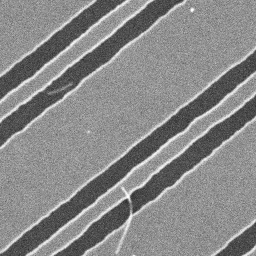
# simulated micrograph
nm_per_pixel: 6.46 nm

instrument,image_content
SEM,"lines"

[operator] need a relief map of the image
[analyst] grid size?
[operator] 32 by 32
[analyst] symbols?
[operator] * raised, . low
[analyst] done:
************...****...**********
**********....***....***********
*********....***....************
********...****....*************
******....****...***************
*****....****...****************
****....***....*****************
***...****....****************..
*....****...*****************...
....****...*****************...*
...***....*****************...**
.****....****************....***
****....****************....***.
**....*****************....***..
*....*****************...****...
....****************....***....*
..*****************....***....**
.*****************...****...****
****************....***....*****
***************....***....******
**************...****....*******
*************...****...*********
***********....****...**********
**********....***....***********
*********....***....************
********....***...**************
******....***....***************
*****....***....****************
****....***....****************.
***...****...*****************..
*....****...****************....
....***....****************....*